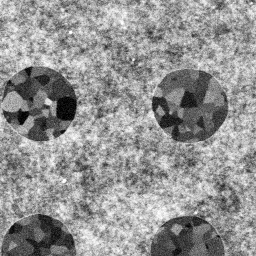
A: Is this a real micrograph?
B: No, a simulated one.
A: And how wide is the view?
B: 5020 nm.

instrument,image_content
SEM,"raised bodies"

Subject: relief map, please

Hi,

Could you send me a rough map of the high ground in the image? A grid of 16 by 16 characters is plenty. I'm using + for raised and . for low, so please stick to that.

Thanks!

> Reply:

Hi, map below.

................
................
................
................
.+++.......++...
+++++.....++++..
+++++.....++++..
+++++.....++++..
.+++.......++...
................
................
................
................
..+.............
++++......++++..
+++++....+++++..